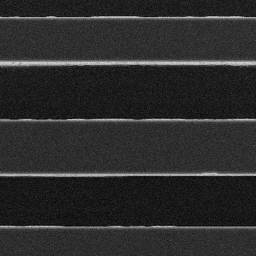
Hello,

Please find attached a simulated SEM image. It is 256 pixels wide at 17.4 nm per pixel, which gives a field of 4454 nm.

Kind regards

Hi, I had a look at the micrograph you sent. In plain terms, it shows lines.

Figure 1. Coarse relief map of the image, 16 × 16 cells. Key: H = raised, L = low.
LLLLLLLLLLLLLLLL
HHHHHHHHHHHHHHHH
HHHHHHHHHHHHHHHH
HHHHHHHHHHHHHHHH
LLLLLLLLLLLLLLLL
LLLLLLLLLLLLLLLL
LLLLLLLLLLLLLLLL
LLLLLLLLLLLLLLLL
HHHHHHHHHHHHHHHH
HHHHHHHHHHHHHHHH
HHHHHHHHHHHHHHHH
LLLLLLLLLLLLLLLL
LLLLLLLLLLLLLLLL
LLLLLLLLLLLLLLLL
HHHHHHHHHHHHHHHH
HHHHHHHHHHHHHHHH